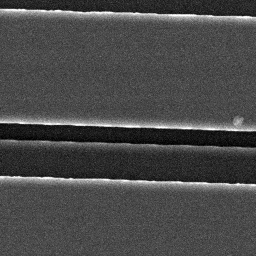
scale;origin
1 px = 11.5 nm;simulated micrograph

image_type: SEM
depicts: lines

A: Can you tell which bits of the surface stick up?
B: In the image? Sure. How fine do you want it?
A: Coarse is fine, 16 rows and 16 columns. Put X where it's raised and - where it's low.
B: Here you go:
----------------
XXXXXXXXXXXXXXXX
XXXXXXXXXXXXXXXX
XXXXXXXXXXXXXXXX
XXXXXXXXXXXXXXXX
XXXXXXXXXXXXXXXX
XXXXXXXXXXXXXXXX
XXXXXXXXXXXXXXXX
----------------
----------------
----------------
XXXXXXXXXXXXXXX-
XXXXXXXXXXXXXXXX
XXXXXXXXXXXXXXXX
XXXXXXXXXXXXXXXX
XXXXXXXXXXXXXXXX